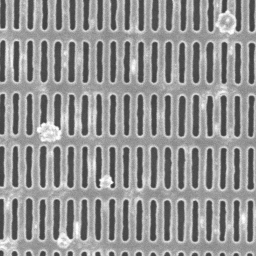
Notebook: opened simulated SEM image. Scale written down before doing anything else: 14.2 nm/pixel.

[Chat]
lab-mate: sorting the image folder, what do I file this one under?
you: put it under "a regular array of holes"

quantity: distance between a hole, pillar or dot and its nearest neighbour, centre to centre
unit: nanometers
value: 195